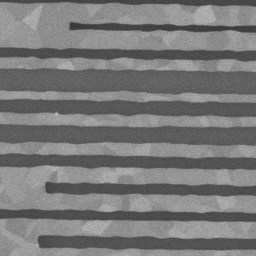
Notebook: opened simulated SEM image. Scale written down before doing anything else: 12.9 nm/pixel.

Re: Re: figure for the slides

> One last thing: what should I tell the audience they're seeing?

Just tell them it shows groups of lines, slits or small figures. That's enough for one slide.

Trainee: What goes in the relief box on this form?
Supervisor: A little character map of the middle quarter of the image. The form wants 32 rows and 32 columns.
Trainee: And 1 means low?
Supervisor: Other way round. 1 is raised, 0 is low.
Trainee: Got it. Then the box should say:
11111111111111111111111111111111
00000000000000000000000000000011
00000000000000000000000000000000
00000000000000000000000000000000
00000000000000000000000000000000
00000000000000000000000000000000
00000000000000000000000000000000
11111111111111111111110111000111
11111111111111111111111111111111
00000000000000000000000000000000
00000000000000000000000000000000
00000000000000000000000000000000
00000000000000000000000000000000
11111111111111111111111111111111
11111111111111111111111111111111
00000000000000001111111100000011
00000000000000000000000000000000
00000000000000000000000000000000
00000000000000000000000000000000
00000000000000000000000000000000
11111111111111111111111111111111
11111111111111111111111111111111
11111111111111111111111111111111
00000000000000000000000000000000
00000000000000000000000000000000
00000000000000000000000000000000
11111111111111111111111111111111
11111111111111111111111111111111
11111111111111111111111111111111
01110011111111111111111111111111
00000000000000000000000000000000
00000000000000000000000000000000